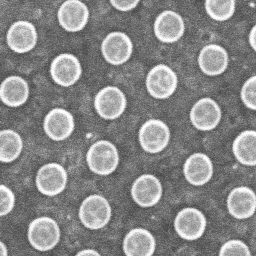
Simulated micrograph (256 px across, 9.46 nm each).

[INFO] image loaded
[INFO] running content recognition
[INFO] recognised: a regular array of raised bodies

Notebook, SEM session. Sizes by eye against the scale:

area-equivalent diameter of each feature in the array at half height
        0.271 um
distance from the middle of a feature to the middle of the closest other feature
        519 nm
